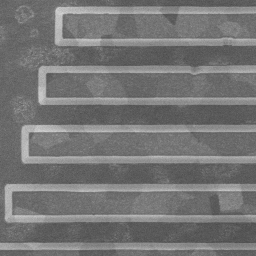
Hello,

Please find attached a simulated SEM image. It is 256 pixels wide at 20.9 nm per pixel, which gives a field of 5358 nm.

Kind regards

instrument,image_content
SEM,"parallel lines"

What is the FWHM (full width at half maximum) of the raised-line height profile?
0.636 micrometres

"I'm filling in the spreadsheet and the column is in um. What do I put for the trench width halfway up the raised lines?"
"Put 0.599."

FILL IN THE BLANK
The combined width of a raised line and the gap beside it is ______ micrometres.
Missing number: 1.23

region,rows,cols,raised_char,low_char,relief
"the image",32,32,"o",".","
................................
........oooooooooooooooooooooooo
.......ooooooooooooooooooooooooo
.......ooooooooooooooooooooooooo
.......ooooooooooooooooooooooooo
................................
................................
................................
................................
.....ooooooooooooooooooooooooooo
.....ooooooooooooooooooooooooooo
.....ooooooooooooooooooooooooooo
......oooooooooooooooooooooooooo
................................
................................
................................
...ooooooooooooooooooooooooooooo
...ooooooooooooooooooooooooooooo
...ooooooooooooooooooooooooooooo
...ooooooooooooooooooooooooooooo
................................
................................
................................
................................
.ooooooooooooooooooooooooooooooo
.ooooooooooooooooooooooooooooooo
.ooooooooooooooooooooooooooooooo
................................
................................
................................
................................
oooooooooooooooooooooooooooooooo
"